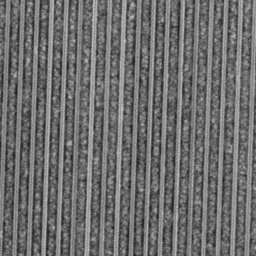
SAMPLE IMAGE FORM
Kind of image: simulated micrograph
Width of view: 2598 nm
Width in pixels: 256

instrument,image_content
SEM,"parallel lines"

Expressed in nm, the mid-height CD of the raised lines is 34.2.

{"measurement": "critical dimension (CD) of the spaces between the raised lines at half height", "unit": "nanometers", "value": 113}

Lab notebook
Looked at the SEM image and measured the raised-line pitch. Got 147 nanometres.